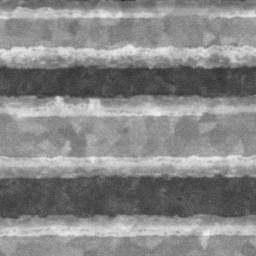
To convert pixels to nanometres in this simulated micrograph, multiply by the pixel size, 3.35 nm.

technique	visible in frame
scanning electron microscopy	one or a few lines or trenches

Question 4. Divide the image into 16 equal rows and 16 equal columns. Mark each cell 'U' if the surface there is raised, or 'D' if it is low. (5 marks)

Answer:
DDDDDDDDDDDDDDDD
UUUUUUUUUUUUUUUU
UUUUUUUUUUUUUUUU
UUDDUUUUDDDDDDDD
DDDDDDDDDDDDDDDD
DDDDDDDDDDDDDDDD
DDDUDUDDDDDDDDDD
UUUUUUUUUUUUUUUU
UUUUUUUUUUUUUUUU
UUUUUUUUUUUUUUUU
DDDDDDDDDDDDDDDD
DDDDDDDDDDDDDDDD
DDDDDDDDDDDDDDDD
DDDDDDDDDDDDDDDD
UUUUUUUUUUUUUUUU
UUUUUUUUUUUUUUUU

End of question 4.